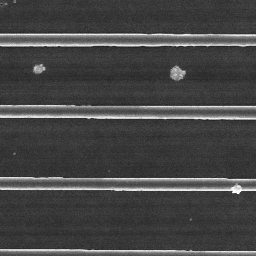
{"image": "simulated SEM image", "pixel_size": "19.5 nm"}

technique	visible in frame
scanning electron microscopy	lines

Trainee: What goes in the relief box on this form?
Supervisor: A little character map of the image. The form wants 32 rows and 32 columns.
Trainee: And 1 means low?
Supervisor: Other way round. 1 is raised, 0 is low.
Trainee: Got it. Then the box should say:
00000000000000000000000000000000
00000000000000000000000000000000
00000000000000000000000000000000
00000000000000000000000000000000
11111111111111111111111111111111
11111111111111111111111111111111
00000000000000000000000000000000
00000000000000000000000000000000
00000000000000000000000000000000
00000000000000000000000000000000
00000000000000000000000000000000
00000000000000000000000000000000
00000000000000000000000000000000
11111111111111111111111111111111
11111111111111111111111111111111
00000000000000000000000000000000
00000000000000000000000000000000
00000000000000000000000000000000
00000000000000000000000000000000
00000000000000000000000000000000
00000000000000000000000000000000
00000000000000000000000000000000
11111111111111111111111111111111
11111111111111111111111111111111
00000000000000000000000000000000
00000000000000000000000000000000
00000000000000000000000000000000
00000000000000000000000000000000
00000000000000000000000000000000
00000000000000000000000000000000
00000000000000000000000000000000
11111111111111111111111111111110